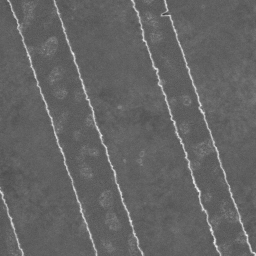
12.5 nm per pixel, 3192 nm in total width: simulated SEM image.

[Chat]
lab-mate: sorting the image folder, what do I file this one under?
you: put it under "one or a few lines or trenches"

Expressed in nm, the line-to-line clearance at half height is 903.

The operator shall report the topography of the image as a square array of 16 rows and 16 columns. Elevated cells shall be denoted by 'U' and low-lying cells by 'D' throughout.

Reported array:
DUUUDDDDUUDDDDDD
DUUUDDDDDUUDDDDD
DUUUDDDDDUUDDDDD
DDUUUDDDDUUDDDDD
DDUUUDDDDDUUDDDD
DDUUUDDDDDUUDDDD
DDDUUUDDDDUUDDDD
DDDUUUDDDDDUUDDD
DDDUUUDDDDDUUDDD
DDDDUUUDDDDDUUDD
DDDDUUUDDDDDUUDD
DDDDDUUDDDDDUUDD
DDDDDUUUDDDDDUUD
UDDDDUUUDDDDDUUD
UDDDDDUUDDDDDUUD
UDDDDDUUUDDDDDUU